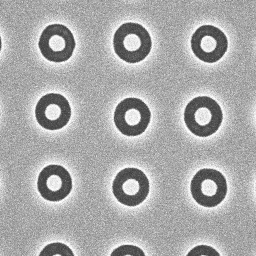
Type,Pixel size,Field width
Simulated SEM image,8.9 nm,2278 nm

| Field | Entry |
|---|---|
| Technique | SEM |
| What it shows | a regular array of ring-shaped grooves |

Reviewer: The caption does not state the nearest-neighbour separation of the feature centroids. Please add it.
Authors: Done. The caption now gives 0.635 µm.